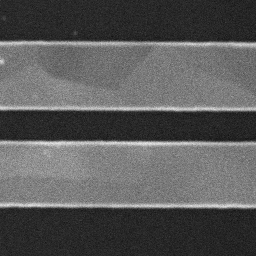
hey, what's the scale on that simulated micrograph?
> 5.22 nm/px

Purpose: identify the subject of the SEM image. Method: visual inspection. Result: wiring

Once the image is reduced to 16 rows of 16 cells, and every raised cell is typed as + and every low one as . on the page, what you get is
................
................
................
++++++++++++++++
++++++++++++++++
++++++++++++++++
++++++++++++++++
................
................
++++++++++++++++
++++++++++++++++
++++++++++++++++
++++++++++++++++
................
................
................